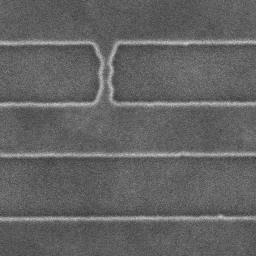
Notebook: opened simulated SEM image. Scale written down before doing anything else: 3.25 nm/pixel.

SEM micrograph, one or a few lines or trenches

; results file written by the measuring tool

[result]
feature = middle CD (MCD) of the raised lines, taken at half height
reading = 172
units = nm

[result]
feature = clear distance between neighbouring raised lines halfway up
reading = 198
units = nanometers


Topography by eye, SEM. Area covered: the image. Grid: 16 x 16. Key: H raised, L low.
HHHHHHHHHHHHHHHH
HHHHHHHHHHHHHHHH
HHHHHHHHHHHHHHHH
LLLLLLHLLLLLLLLL
LLLLLLHLLLLLLLLL
LLLLLLHLLLLLLLLL
LHHHHHHHHHHHHHHH
HHHHHHHHHHHHHHHH
HHHHHHHHHHHHHHHH
HHHHHHHHHHHHHHHH
LLLLLLLLLLLLLLLL
LLLLLLLLLLLLLLLL
LLLLLLLLLLLLLLLL
LLLLLLLLLLLLLLLL
HHHHHHHHHHHHHHHH
HHHHHHHHHHHHHHHH